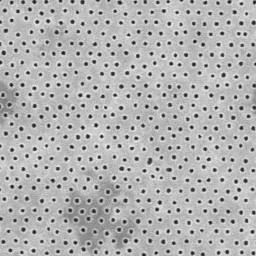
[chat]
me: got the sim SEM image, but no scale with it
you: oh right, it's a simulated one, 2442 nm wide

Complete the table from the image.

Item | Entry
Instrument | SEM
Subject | a regular array of holes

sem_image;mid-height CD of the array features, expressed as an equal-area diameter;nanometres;40.3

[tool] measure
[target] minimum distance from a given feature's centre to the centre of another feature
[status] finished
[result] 97.2 nanometers